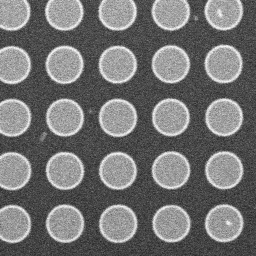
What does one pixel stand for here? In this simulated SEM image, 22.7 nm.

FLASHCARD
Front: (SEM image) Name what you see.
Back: an array of small figures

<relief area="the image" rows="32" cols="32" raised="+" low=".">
++++..++++...++++..++++...++++..
++++..++++..+++++..+++++..++++..
+++...++++...++++..++++...++++..
++.....++.....++....++.....++...
................................
................................
+++...++++...+++....+++...++++..
++++..++++..+++++..+++++..++++..
++++..++++..+++++..+++++..++++..
+++...++++...++++...+++...++++..
................................
................................
.+.....++.....+......+.....++...
+++...++++...++++..++++...++++..
++++..++++..+++++..+++++..++++..
++++..++++...++++..++++...++++..
+++....+++...+++....+++....++...
................................
................................
+++....++....+++....+++....+++..
++++..++++...++++..+++++..++++..
++++..++++..+++++..+++++..++++..
+++...++++...++++..++++...++++..
.+.....++.....++.....+.....++...
................................
................................
+++...++++...++++...+++...++++..
++++..++++..+++++..+++++..++++..
++++..++++..+++++..+++++..++++..
+++...++++...+++....+++...++++..
................................
................................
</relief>